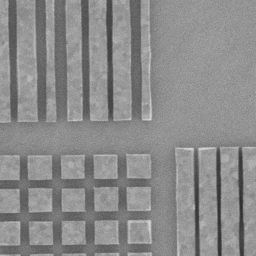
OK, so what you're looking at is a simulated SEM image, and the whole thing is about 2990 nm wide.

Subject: groups of lines, slits or small figures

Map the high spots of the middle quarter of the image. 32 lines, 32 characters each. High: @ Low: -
-@@@---@@@@-@@@@@--@@-----------
-@@@---@@@@--@@@@---@-----------
-@@@---@@@@--@@@@---@-----------
-@@@---@@@@--@@@@---@-----------
-@@@---@@@@--@@@@---@-----------
-@@@---@@@@--@@@@---@-----------
-@@@---@@@@--@@@@---@-----------
-@@@---@@@@--@@@@---@-----------
-@@@---@@@@--@@@@---@-----------
-@@@---@@@@--@@@@---@-----------
-@@@---@@@@--@@@@---@@----------
-@@@---@@@@--@@@@---@@----------
-@@@---@@@@--@@@@---@@----------
-@@@---@@@@--@@@@---@@----------
--------------------------------
--------------------------------
--------------------------------
--------------------------------
--------------------------------
--------------------------------
--------------------------------
----------------------------@@@@
----------------------------@@@@
@@@@@---@@@@@---@@@@@-------@@@@
@@@@@---@@@@@---@@@@@-------@@@@
@@@@@---@@@@@---@@@@@-------@@@@
@@@@@---@@@@@---@@@@@-------@@@@
@@@@@---@@@@@---@@@@@-------@@@@
----------------------------@@@@
----------------------------@@@@
----------------------------@@@@
@@@@@---@@@@@---@@@@@-------@@@@